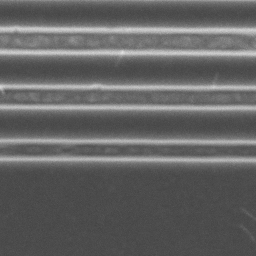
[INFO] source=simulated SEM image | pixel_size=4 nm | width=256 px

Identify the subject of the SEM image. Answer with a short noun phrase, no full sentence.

parallel lines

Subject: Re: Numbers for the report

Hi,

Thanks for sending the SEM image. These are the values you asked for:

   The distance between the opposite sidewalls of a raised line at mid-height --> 36.4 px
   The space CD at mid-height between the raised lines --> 18.6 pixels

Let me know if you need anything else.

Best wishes